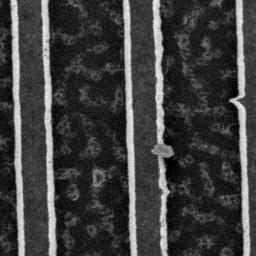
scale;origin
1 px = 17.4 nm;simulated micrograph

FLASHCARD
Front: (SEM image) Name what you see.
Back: one or a few lines or trenches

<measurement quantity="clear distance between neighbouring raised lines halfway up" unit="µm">1.41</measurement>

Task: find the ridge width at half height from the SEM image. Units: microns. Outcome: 0.536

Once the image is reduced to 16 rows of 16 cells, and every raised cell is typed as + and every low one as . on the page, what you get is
.++.....++.....+
.++.....++.....+
.++.....++.....+
.++.....++.....+
.++.....++.....+
.++.....++.....+
.++.....++.....+
.++.....++.....+
.++.....++.....+
.++.....+++....+
.++.....++.....+
.++.....++.....+
.++.....++.....+
.++.....++.....+
.++.....++.....+
.++.....++.....+